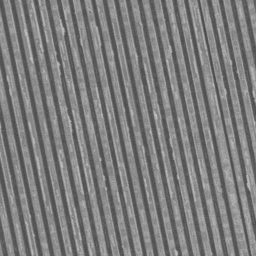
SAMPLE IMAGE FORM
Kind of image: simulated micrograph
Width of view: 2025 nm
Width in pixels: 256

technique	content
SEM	parallel lines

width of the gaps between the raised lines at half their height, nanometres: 37.3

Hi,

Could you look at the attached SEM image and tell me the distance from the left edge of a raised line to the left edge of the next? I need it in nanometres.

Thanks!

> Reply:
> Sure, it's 89.9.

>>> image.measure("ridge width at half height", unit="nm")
52.3